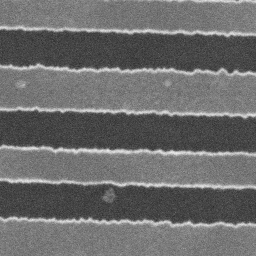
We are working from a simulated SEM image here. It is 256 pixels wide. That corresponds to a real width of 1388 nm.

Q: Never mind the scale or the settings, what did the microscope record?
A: lines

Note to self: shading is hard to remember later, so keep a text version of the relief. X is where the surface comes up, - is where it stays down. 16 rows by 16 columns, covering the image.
XXXXXXXXXXXXXXXX
XXXXXXXXXXXXXXXX
----------------
----------------
XXXXXXXXXXXXXX--
XXXXXXXXXXXXXXXX
XXXXXXXXXXXXXXXX
----------------
----------------
XXXXXXXXXXXXX---
XXXXXXXXXXXXXXXX
-----X-XXXXXXXXX
----------------
----------------
XXXXXXXXXXXXXXXX
XXXXXXXXXXXXXXXX